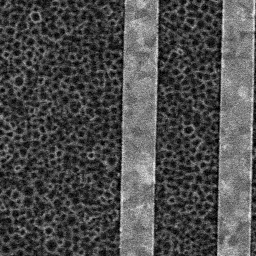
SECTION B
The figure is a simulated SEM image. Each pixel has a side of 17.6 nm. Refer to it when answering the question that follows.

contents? one or a few lines or trenches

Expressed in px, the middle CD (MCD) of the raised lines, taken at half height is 32.9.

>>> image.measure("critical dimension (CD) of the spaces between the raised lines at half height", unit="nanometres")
1140